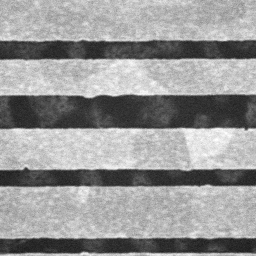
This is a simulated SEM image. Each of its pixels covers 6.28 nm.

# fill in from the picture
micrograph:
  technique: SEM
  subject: one or a few lines or trenches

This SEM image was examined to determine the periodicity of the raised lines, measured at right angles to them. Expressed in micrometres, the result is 0.424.